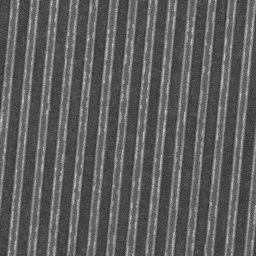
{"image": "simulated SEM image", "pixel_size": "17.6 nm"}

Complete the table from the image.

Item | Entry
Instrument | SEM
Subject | parallel lines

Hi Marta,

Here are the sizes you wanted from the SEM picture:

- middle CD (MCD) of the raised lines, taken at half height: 140 nanometers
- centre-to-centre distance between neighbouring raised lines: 0.345 micrometres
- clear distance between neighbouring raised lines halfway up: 0.216 micrometres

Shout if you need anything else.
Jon